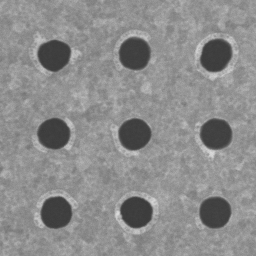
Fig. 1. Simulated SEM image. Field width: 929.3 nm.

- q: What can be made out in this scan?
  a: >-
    a regular array of holes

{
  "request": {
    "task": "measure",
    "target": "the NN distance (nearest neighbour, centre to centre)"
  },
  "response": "285 nanometres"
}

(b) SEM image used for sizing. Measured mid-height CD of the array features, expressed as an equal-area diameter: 116 nm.